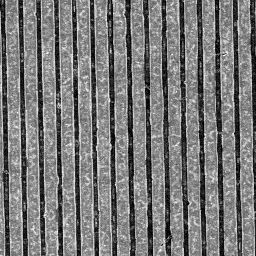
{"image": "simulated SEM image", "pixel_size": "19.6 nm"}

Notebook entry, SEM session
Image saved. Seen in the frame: parallel lines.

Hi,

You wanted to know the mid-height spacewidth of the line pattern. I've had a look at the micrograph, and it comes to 120 nanometres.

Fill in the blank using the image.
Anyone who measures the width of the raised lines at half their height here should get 228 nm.